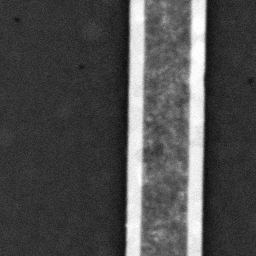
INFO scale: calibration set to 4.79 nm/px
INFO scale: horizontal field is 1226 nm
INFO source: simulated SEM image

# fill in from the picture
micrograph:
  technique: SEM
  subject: one or a few lines or trenches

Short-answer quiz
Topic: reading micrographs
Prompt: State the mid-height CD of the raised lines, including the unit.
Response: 0.286 um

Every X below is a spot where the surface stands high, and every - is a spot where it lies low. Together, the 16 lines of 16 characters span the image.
---------XXX----
---------XXX----
---------XXX----
---------XXX----
---------XXX----
---------XXX----
---------XXX----
---------XXX----
---------XXX----
--------XXXX----
--------XXXX----
--------XXXX----
--------XXXX----
--------XXXX----
--------XXXX----
--------XXXX----